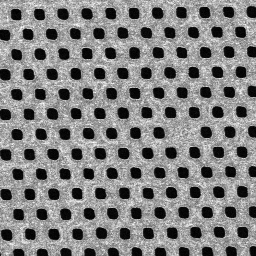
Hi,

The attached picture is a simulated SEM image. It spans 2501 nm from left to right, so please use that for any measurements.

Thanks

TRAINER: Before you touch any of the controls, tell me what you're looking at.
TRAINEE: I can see a regular array of holes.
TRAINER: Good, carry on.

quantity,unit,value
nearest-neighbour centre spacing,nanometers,224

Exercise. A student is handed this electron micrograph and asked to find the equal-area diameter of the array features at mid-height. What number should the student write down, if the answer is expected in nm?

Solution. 116